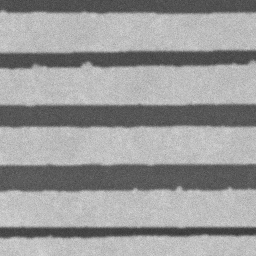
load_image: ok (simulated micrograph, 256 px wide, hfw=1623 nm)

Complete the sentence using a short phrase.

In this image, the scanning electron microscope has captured lines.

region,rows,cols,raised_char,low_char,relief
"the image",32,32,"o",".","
................................
................................
oooooooooooooooooooooooooooooooo
oooooooooooooooooooooooooooooooo
oooooooooooooooooooooooooooooooo
oooooooooooooooooooooooooooooooo
ooooooooo.......................
................................
..........oooooooooooooooooooooo
oooooooooooooooooooooooooooooooo
oooooooooooooooooooooooooooooooo
oooooooooooooooooooooooooooooooo
oooooooooooooooooooooooooooooooo
................................
................................
................................
oooooooooooooooooooooooooooooooo
oooooooooooooooooooooooooooooooo
oooooooooooooooooooooooooooooooo
oooooooooooooooooooooooooooooooo
oooooooooo...oo...oo............
................................
................................
................................
oooooooooooooooooooooooooooooooo
oooooooooooooooooooooooooooooooo
oooooooooooooooooooooooooooooooo
oooooooooooooooooooooooooooooooo
................................
.........................o......
oooooooooooooooooooooooooooooooo
oooooooooooooooooooooooooooooooo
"